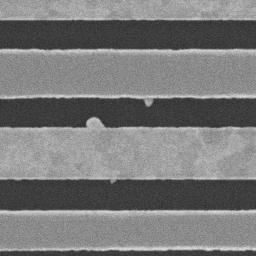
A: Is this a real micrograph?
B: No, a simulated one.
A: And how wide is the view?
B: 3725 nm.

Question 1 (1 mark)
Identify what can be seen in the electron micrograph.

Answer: lines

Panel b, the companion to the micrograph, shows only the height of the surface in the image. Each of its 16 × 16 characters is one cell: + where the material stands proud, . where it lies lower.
++++++++++++++++
................
................
++++++++++++++++
++++++++++++++++
++++++++++++++++
................
................
++++++++++++++++
++++++++++++++++
++++++++++++++++
................
................
++++++++++++++++
++++++++++++++++
++++++++++++++++